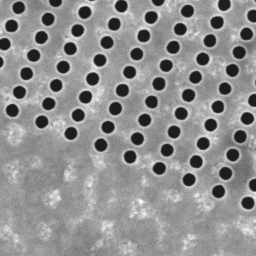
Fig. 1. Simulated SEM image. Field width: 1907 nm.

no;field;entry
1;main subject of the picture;a regular array of holes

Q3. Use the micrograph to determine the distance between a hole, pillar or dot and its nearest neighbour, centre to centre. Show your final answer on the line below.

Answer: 145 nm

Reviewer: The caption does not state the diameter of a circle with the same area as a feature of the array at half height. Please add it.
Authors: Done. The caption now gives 95 nm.